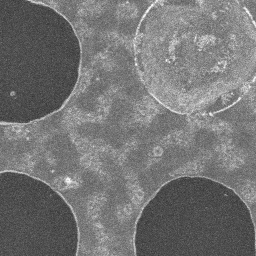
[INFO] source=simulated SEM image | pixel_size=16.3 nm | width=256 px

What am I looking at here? holes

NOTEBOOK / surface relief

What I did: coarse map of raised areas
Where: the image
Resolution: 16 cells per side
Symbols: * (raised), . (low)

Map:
...*************
....************
.....***********
.....***********
.....***********
.....***********
....************
..**************
****************
****************
****************
...*******....**
....*****......*
.....****.......
.....***........
.....***........